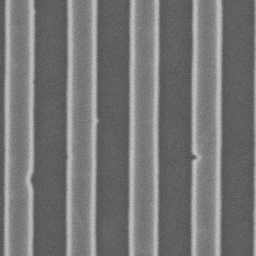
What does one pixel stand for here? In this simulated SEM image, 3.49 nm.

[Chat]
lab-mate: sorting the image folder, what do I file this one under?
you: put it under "parallel lines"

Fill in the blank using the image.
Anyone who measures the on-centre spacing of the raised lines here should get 62.5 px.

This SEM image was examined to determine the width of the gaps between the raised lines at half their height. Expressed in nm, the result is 128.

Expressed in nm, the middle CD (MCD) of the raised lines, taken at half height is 93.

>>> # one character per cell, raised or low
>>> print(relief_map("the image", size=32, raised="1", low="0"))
01110000011100001111000011100000
01110000011100001111000011100000
01110000011100001111000011100000
01110000011100001111000011100000
01110000011100001111000011100000
01110000011100001111000011100000
01110000011100001111000011100000
01110000011100000111000011100000
01110000011100001111000011100000
01110000011100001111000011100000
01110000011100001111000011110000
01110000011100001111000011110000
01110000011100001111000011100000
01110000011100001111000011100000
01110000011100001110000011100000
01110000011100000110000011100000
01110000011100001111000011110000
01110000011100001111000011110000
01110000011100001111000011100000
01110000011100001111000001100000
01110000011100001111000011100000
01110000011100001111000011100000
01110000011100001111000011100000
01110000011100001111000011100000
01110000011100001111000011100000
01110000011100001111000011100000
01110000011100001111000011100000
01110000011100001111000011100000
01110000011100001111000011100000
01110000011100001111000011100000
01110000011100001111000011100000
01110000011100001111000011100000